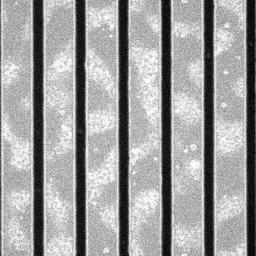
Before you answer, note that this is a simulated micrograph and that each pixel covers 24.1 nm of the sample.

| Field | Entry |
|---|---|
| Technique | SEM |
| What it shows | parallel lines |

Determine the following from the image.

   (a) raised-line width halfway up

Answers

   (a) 774 nanometers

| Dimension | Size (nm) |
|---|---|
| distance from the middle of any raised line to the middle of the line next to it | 1030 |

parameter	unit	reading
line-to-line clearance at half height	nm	244